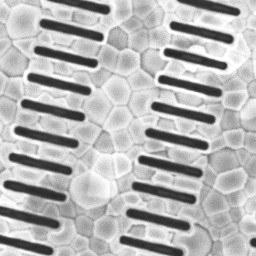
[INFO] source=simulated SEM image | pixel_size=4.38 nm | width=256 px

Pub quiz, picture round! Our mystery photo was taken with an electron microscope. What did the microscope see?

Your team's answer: a regular array of holes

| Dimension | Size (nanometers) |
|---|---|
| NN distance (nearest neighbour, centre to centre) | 120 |